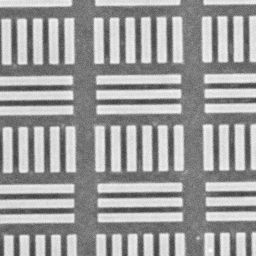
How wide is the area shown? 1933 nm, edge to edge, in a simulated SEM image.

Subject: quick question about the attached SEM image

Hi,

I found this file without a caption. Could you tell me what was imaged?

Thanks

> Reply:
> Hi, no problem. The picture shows groups of lines, slits or small figures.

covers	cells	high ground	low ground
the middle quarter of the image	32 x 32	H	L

LLLLLLLLLLLLLLLLLLLLLLLLLLLLLLLL
LLLLLLLLLLLLLLLLLLLLLLLLLLLLLLLL
LLLLLLLLLLLLLLLLLLLLLLLLLLLLLLLL
HHLLLLLLHHHHHHHHHHHHHHHHHHHHHLLL
HHLLLLLLHHHHHHHHHHHHHHHHHHHHHLLL
LLLLLLLLLLLLLLLLLLLLLLLLLLLLLLLL
LLLLLLLLLLLLLLLLLLLLLLLLLLLLLLLL
HHLLLLLLHHHHHHHHHHHHHHHHHHHHHLLL
HHLLLLLLHHHHHHHHHHHHHHHHHHLLLLLL
LLLLLLLLLLLLLLLLLLLLLLLLLLLLLLLL
LLLLLLLLHHHHHHHHHHHHHHHHHHHHHLLL
HHLLLLLLHHHHHHHHHHHHHHHHHHHHHLLL
LLLLLLLLLLLLLLLLLLLLLLLLLLLLLLLL
LLLLLLLLLLLLLLLLLLLLLLLLLLLLLLLL
LLLLLLLLLLLLLLLLLLLLLLLLLLLLLLLL
LLLLLLLLLLLLLLLLLLLLLLLLLLLLHLLL
LHHLLLLLHHLLHHLLHHLLHHLLHHLLHHLL
LHHLLLLLHHLLHHLLHHLLHHLLHHLLHHLL
LHHLLLLLHHLLHHLLHHLLHHLLHHLLHHLL
LHHLLLLLHHLLHHLLHHLLHHLLHHLLHHLL
LHHLLLLLHHLLHHLLHHLLHHLLHHLLHHLL
LHHLLLLLHHLLHHLLHHLLHHLLHHLLHHLL
LHHLLLLLHHLLHHLLHHLLHHLLHHLLHHLL
LHHLLLLLHHLLHHLLHHLLHHLLHHLLHHLL
LHHLLLLLHHLLHHLLHHLLHHLLHHLLHHLL
LHHLLLLLHHLLHHLLHHLLHHLLHHLLHHLL
LHHLLLLLHHLLHHLLHHLLHHLLHHLLLLLL
LLLLLLLLLLLLLLLLLLLLLLLLLLLLLLLL
LLLLLLLLLLLLLLLLLLLLLLLLLLLLLLLL
LLLLLLLLLLLLLLLLLLLLLLLLLLLLLLLL
HHLLLLLLLHHHHHHHHHHHHHHHHHHHHLLL
HHLLLLLLLHHHHHHHHHHHHHHHHHHHHLLL